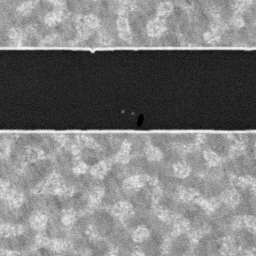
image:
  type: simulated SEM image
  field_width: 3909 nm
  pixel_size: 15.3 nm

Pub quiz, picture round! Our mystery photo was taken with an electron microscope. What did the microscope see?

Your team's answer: one or a few lines or trenches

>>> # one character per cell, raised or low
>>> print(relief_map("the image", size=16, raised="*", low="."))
****************
****************
****************
................
................
................
................
................
****************
****************
****************
****************
****************
****************
****************
****************